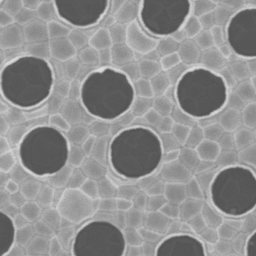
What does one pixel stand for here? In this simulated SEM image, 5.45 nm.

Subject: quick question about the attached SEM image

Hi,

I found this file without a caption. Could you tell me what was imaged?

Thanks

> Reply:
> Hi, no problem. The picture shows holes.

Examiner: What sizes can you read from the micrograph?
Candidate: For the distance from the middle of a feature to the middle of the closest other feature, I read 391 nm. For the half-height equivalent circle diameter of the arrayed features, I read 0.27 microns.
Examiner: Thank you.